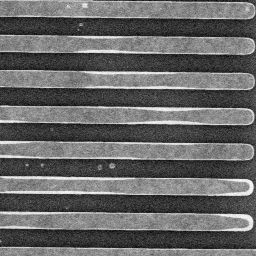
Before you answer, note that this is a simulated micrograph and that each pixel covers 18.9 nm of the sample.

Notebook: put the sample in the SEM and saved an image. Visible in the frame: groups of lines, slits or small figures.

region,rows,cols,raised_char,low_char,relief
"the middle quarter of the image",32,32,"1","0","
00000000000000000000000000000000
00000000000000000000000000000000
11111111111111111111111111111111
11111111111111111111111111111111
11111111111111111111111111111111
11111111111111111111111111111111
00000000000000000000000000000000
00000000000000000000000000000000
00000000000000000000000000000000
00000000000000000000000000000000
00000000000000000000000000000000
11111111111111111111111111111111
11111111111111111111111111111111
11111111111111111111111111111111
11111111111111111111111100000111
00000000000000000000000000000000
00000000000000000000000000000000
00000000000000000000000000000000
00000000000000000000000000000000
00000000000000000000000000000000
11111111111111111111111111111111
11111111111111111111111111111111
11111111111111111111111111111111
00000000000000000011111111111111
00000000000000000000000000000000
00000000000000000000000000000000
00000000000000000000000000000000
00000000000000000000000000000000
00000000000000000000000000000000
11111111111111111111111111111111
11111111111111111111111111111111
11111111111111111111111111111111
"